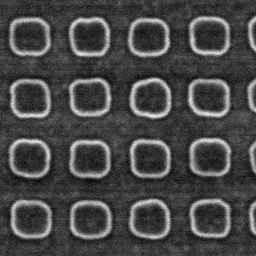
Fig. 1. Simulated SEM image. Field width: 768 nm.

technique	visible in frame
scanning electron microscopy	a regular array of raised bodies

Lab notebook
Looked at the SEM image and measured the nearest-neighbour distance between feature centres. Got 179 nm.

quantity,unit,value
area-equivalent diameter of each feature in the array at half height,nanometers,119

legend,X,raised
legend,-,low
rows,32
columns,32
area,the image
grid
--------------------------------
--------------------------------
---XX-----X--------------XX-----
-XXXXX---XXXX---XXXXX---XXXX---X
-XXXXX---XXXX---XXXXX---XXXXX--X
--XXXX---XXXX---XXXXX---XXXXX---
--XXX-----XXX----XXX-----XXX----
--------------------------------
--------------------------------
--------------------------------
--XXX----XXXX----XXX----XXXX----
--XXXX---XXXX----XXXX---XXXX---X
--XXXX---XXXXX--XXXXX---XXXXX--X
--XXXX---XXXX----XXXX---XXXX----
-------------------X------------
--------------------------------
--------------------------------
-------------------------X------
-XXXXX---XXXX----XXXX---XXXX----
-XXXXX---XXXX----XXXX---XXXXX---
-XXXXX---XXXX----XXXX---XXXXX---
--XXXX---XXXX----XXXX----XXX----
--------------------------------
--------------------------------
--------------------------------
--XXX-----XXX----XXX-----XXX----
--XXXX---XXXXX---XXXX---XXXXX--X
--XXXX---XXXXX---XXXX---XXXXX--X
--XXXX---XXXXX---XXXX---XXXXX---
---XX-----XXX-----XX------------
--------------------------------
--------------------------------